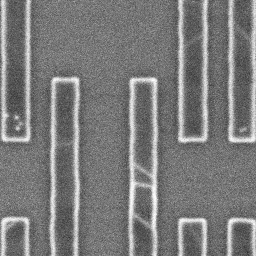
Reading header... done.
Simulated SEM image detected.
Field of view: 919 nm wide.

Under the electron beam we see wiring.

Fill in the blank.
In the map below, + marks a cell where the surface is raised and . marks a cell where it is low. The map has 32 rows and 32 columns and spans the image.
++++..................++++...+++
++++..................++++...+++
++++..................++++...+++
++++..................++++...+++
++++..................++++...+++
++++...................+++...+++
++++..................++++...+++
++++..................++++...+++
++++..................++++...+++
++++..................++++...+++
++++...+++......+++...++++...+++
++++...+++......+++...++++...+++
++++...+++......+++...++++...+++
++++...+++......+++...++++...+++
++++...+++......+++...++++...+++
++++...+++......++++..++++...+++
++++..++++......++++..++++...+++
.++....+++......++++...++....+++
......++++......+++.............
......++++......+++.............
......++++......+++.............
......++++......+++.............
.......+++......+++.............
.......+++......................
......++++......................
......++++......................
......++++......................
.++...++++......++.....++....++.
+++...++++......+++...++++...+++
+++...++++......+++...++++...+++
+++...++++......+++...++++...+++
+++....+++......+++...++++...+++